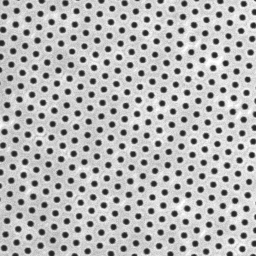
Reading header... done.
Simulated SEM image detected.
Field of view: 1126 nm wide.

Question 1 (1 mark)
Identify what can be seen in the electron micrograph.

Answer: a regular array of holes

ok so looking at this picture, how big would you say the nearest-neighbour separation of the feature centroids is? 0.0585 microns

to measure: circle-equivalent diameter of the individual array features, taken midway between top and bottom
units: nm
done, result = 28.1